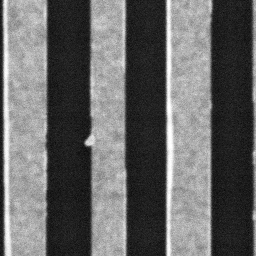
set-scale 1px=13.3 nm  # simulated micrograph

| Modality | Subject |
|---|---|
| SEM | lines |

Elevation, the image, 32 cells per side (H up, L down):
LHHHHHLLLLLHHHHHLLLLLHHHHHLLLLLL
LHHHHHLLLLLHHHHHLLLLLHHHHHLLLLLL
LHHHHHLLLLLHHHHHLLLLLHHHHHLLLLLL
LHHHHHLLLLLHHHHHLLLLLHHHHHLLLLLL
LHHHHHLLLLLHHHHHLLLLLHHHHHLLLLLL
LHHHHHLLLLLHHHHHLLLLLHHHHHLLLLLL
LHHHHHLLLLLHHHHHLLLLLHHHHHLLLLLL
LHHHHHLLLLLHHHHHLLLLLHHHHHLLLLLL
LHHHHHLLLLLHHHHHLLLLLHHHHHLLLLLL
LHHHHHLLLLLHHHHHLLLLLHHHHHLLLLLL
LHHHHHLLLLLHHHHHLLLLLHHHHHLLLLLL
LHHHHHLLLLLHHHHHLLLLLHHHHHLLLLLL
LHHHHHLLLLLHHHHHLLLLLHHHHHLLLLLL
LHHHHHLLLLLHHHHHLLLLLHHHHHLLLLLL
LHHHHHLLLLLHHHHHLLLLLHHHHHLLLLLL
LHHHHHLLLLLLHHHHLLLLLHHHHHLLLLLL
LHHHHHLLLLLHHHHHLLLLLHHHHHLLLLLL
LHHHHHLLLLLHHHHHLLLLLHHHHHLLLLLL
LHHHHHLLLLLHHHHHLLLLLHHHHHLLLLLL
LHHHHHLLLLLLHHHHLLLLLHHHHHLLLLLL
LHHHHHLLLLLLHHHHLLLLLHHHHHLLLLLL
LHHHHHLLLLLLHHHHLLLLLHHHHHLLLLLL
LHHHHHLLLLLLHHHHLLLLLHHHHHLLLLLL
LHHHHHLLLLLLHHHHLLLLLHHHHHLLLLLL
LHHHHHLLLLLLHHHHLLLLLHHHHHLLLLLL
LHHHHHLLLLLLHHHHLLLLLHHHHHLLLLLL
LHHHHHLLLLLLHHHHLLLLLHHHHHLLLLLL
LHHHHHLLLLLLHHHHLLLLLHHHHHLLLLLL
LHHHHHLLLLLLHHHHLLLLLHHHHHLLLLLL
LHHHHHLLLLLLHHHHLLLLLHHHHHLLLLLL
LHHHHHLLLLLLHHHHLLLLLHHHHHLLLLLL
LHHHHHLLLLLLHHHHLLLLLHHHHHLLLLLL